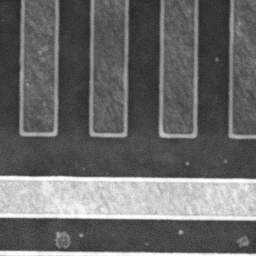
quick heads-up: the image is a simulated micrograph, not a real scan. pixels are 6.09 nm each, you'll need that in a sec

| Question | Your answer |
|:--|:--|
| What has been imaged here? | groups of lines, slits or small figures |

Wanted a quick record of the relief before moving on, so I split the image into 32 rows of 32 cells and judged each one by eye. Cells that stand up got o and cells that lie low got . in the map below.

...oooo.....oooo....ooooo....ooo
...oooo.....oooo....ooooo....ooo
...oooo.....oooo....ooooo....ooo
...oooo.....oooo....ooooo....ooo
...oooo.....oooo....oooo.....ooo
...oooo.....oooo....oooo.....ooo
...oooo.....oooo....oooo.....ooo
...oooo.....oooo....oooo.....ooo
...oooo.....oooo....oooo.....ooo
...oooo.....oooo....oooo.....ooo
...oooo.....oooo....oooo.....ooo
...oooo.....oooo....oooo.....ooo
...oooo....ooooo....oooo.....ooo
...oooo....ooooo....oooo.....ooo
...oooo....ooooo....oooo.....ooo
...oooo....ooooo....oooo.....ooo
...oooo.....oooo....oooo.....ooo
................................
................................
................................
................................
................................
oooooooooo.oo...................
oooooooooooooooooooooooooooooooo
oooooooooooooooooooooooooooooooo
oooooooooooooooooooooooooooooooo
oooooooooooooooooooooooooooooooo
................................
................................
................................
................................
................................